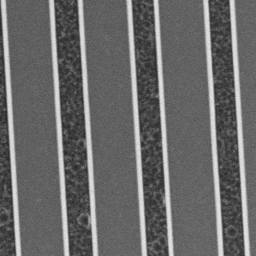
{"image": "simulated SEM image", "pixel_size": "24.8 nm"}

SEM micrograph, one or a few lines or trenches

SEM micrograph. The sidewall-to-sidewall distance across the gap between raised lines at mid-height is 1210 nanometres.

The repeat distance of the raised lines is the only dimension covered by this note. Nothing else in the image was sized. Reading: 1890 nm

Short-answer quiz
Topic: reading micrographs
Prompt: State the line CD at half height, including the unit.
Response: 655 nanometers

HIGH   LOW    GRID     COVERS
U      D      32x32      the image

DDDDDDDUUUDDDDDDUUUDDDDDDDUUUDDD
DDDDDDDUUUDDDDDDUUUDDDDDDDUUUDDD
DDDDDDDUUUDDDDDDUUUUDDDDDDUUUDDD
UDDDDDDUUUDDDDDDUUUUDDDDDDUUUDDD
UDDDDDDUUUDDDDDDDUUUDDDDDDUUUDDD
UDDDDDDUUUDDDDDDDUUUDDDDDDUUUDDD
UDDDDDDUUUDDDDDDDUUUDDDDDDUUUDDD
UDDDDDDUUUDDDDDDDUUUDDDDDDUUUDDD
UDDDDDDUUUDDDDDDDUUUDDDDDDUUUDDD
UDDDDDDUUUDDDDDDDUUUDDDDDDUUUUDD
UDDDDDDUUUUDDDDDDUUUDDDDDDUUUUDD
UDDDDDDUUUUDDDDDDUUUDDDDDDDUUUDD
UDDDDDDUUUUDDDDDDUUUDDDDDDDUUUDD
UDDDDDDUUUUDDDDDDUUUDDDDDDDUUUDD
UDDDDDDUUUUDDDDDDUUUDDDDDDDUUUDD
UDDDDDDUUUUDDDDDDUUUDDDDDDDUUUDD
UDDDDDDUUUUDDDDDDUUUDDDDDDDUUUDD
UDDDDDDDUUUDDDDDDUUUDDDDDDDUUUDD
UDDDDDDDUUUDDDDDDUUUUDDDDDDUUUDD
UUDDDDDDUUUDDDDDDUUUUDDDDDDUUUDD
UUDDDDDDUUUDDDDDDDUUUDDDDDDUUUDD
UUDDDDDDUUUDDDDDDDUUUDDDDDDUUUDD
UUDDDDDDUUUDDDDDDDUUUDDDDDDUUUDD
UUDDDDDDUUUDDDDDDDUUUDDDDDDUUUDD
UUDDDDDDUUUDDDDDDDUUUDDDDDDUUUDD
UUDDDDDDUUUDDDDDDDUUUDDDDDDUUUUD
UUDDDDDDUUUUDDDDDDUUUDDDDDDUUUUD
UUDDDDDDUUUUDDDDDDUUUDDDDDDDUUUD
UUDDDDDDUUUUDDDDDDUUUDDDDDDUUUUD
UUDDDDDDUUUUDDDDDDUUUDDDDDDDUUUD
UUDDDDDDUUUUDDDDDDUUUDDDDDDDUUUD
UUDDDDDDUUUUDDDDDDUUUDDDDDDDUUUD